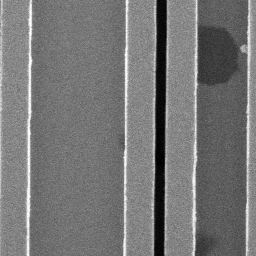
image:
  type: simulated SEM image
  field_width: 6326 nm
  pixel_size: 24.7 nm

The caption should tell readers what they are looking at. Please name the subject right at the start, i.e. lines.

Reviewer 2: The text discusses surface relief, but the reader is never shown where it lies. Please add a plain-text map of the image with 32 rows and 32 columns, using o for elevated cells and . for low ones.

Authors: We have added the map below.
oooo............oooo.oooo......o
oooo............oooo.oooo......o
oooo............oooo.oooo......o
oooo............oooo.oooo......o
oooo............oooo.oooo......o
oooo............oooo.oooo......o
oooo............oooo.oooo......o
oooo............oooo.oooo......o
oooo............ooo..oooo......o
oooo............ooo..oooo......o
oooo............ooo..ooo.......o
oooo............ooo..ooo.......o
oooo............ooo..ooo.......o
oooo............ooo..ooo.......o
oooo............ooo..ooo.......o
oooo............ooo..ooo.......o
oooo............ooo..ooo.......o
oooo............ooo..ooo.......o
oooo............ooo..ooo.......o
oooo............ooo..ooo.......o
oooo............ooo..ooo.......o
oooo............ooo..ooo.......o
oooo............ooo..ooo.......o
oooo............ooo..ooo.......o
oooo............ooo..ooo.......o
oooo............ooo..ooo.......o
oooo............ooo..ooo.......o
oooo............ooo..ooo.......o
oooo............ooo..ooo.......o
oooo............ooo..ooo.......o
oooo............ooo..ooo.......o
oooo............ooo..ooo.......o